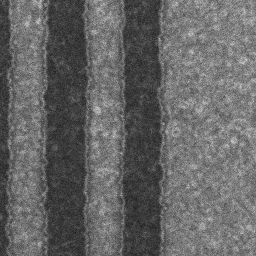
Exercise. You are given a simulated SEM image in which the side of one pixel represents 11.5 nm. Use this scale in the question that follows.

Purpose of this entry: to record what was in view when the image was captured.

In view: one or a few lines or trenches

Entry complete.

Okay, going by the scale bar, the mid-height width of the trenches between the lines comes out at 0.394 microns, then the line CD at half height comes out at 470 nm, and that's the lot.